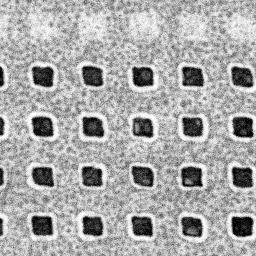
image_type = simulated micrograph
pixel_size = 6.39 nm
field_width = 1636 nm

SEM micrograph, a regular array of holes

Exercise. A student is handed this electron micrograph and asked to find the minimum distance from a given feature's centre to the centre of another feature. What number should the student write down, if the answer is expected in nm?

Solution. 317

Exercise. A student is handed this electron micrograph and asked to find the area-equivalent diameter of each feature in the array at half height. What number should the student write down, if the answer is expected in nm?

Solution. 156